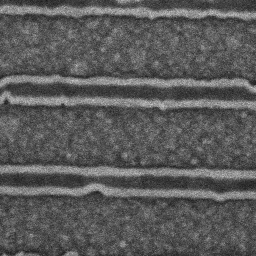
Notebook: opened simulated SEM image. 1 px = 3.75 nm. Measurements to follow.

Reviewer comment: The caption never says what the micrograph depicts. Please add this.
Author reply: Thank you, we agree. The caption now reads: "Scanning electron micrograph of one or a few lines or trenches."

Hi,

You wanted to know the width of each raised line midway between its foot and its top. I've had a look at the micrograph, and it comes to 77.8 nanometers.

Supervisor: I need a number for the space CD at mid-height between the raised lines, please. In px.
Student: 69.7